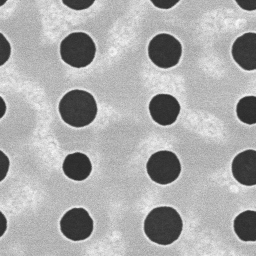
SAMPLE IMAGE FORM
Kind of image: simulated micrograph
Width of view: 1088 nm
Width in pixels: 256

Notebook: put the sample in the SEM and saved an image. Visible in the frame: a regular array of holes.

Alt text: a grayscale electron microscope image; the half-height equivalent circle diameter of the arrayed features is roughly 145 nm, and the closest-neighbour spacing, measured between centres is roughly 247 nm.